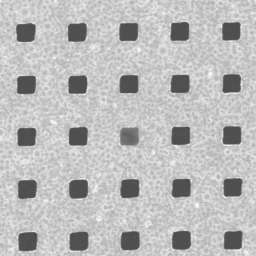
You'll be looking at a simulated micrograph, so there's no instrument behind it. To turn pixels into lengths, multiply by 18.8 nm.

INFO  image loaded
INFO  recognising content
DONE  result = a regular array of holes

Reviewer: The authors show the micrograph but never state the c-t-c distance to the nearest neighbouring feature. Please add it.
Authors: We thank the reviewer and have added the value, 965 nanometres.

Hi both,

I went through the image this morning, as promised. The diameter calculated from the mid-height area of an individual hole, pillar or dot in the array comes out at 390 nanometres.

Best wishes